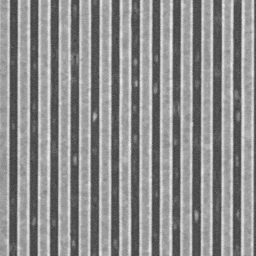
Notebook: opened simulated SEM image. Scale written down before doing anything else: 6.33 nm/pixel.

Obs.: parallel lines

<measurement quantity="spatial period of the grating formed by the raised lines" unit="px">20.4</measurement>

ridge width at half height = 61.7 nm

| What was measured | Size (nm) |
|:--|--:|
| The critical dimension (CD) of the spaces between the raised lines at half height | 68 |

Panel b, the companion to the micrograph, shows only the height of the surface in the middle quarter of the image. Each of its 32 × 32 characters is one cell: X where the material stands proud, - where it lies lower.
X---XX---XX---XX---XXX--XXX---XX
X---XX---XX---XX---XXX--XXX---XX
X---XX---XX---XX---XXX--XXX---XX
X---XX---XX---XXX--XX---XXX---XX
X---XX---XX---XXX--XXX--XXX---XX
X---XX---XX---XXX--XXX--XXX---XX
X---XX---XX---XXX--XXX--XXX---XX
X---XX---XX---XX---XXX--XXX---XX
X---XX---XX---XX---XXX--XXX---XX
X---XX---XX---XX---XXX--XXX---XX
X---XX---XX---XX---XXX--XXX---XX
X---XX---XX---XX---XXX--XXX---XX
X---XX---XX---XX---XXX--XXX---XX
X---XX---XX---XX---XXX--XXX---XX
X---XX---XX---XX---XXX--XXX---XX
X---XX---XX---XX---XXX--XXX---XX
X---XX---XX---XX---XXX--XXX---XX
X---XX---XX---XX---XXX--XXX--XXX
X---XX---XX---XX---XXX--XXX--XXX
X---XX---XX---XX---XXX--XXX--XXX
X---XX---XX---XX---XXX--XXX--XXX
X---XX---XX---XX---XX---XXX--XXX
X---XX---XX---XX---XX---XXX--XXX
X---XX---XX---XX---XX---XXX--XXX
X---XX---XX---XX---XX---XXX--XXX
X---XX---XX---XX---XX---XXX--XXX
X---XX---XX---XX---XX---XXX--XXX
X---XX---XX---XX---XX---XXX--XXX
X---XX---XX---XX---XXX--XXX--XXX
X---XX---XX---XX---XXX--XXX--XXX
X---XX---XX---XX---XXX--XXX--XXX
X---XX---XX---XX---XXX--XXX--XXX